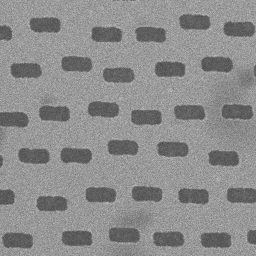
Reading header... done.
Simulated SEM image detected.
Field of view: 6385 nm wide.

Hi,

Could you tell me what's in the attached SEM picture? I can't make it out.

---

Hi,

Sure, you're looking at a regular array of holes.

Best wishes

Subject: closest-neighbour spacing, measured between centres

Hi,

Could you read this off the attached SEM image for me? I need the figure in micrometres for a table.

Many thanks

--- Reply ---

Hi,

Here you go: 1.07